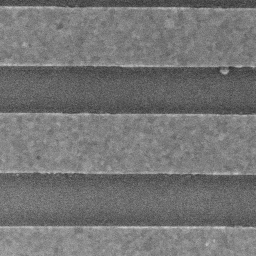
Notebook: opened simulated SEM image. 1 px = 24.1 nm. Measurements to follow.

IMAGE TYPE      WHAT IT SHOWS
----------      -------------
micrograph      lines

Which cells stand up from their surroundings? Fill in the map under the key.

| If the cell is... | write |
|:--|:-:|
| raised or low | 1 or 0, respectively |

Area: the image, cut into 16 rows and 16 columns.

1111000000000000
1111111111111111
1111111111111111
1111111111111111
0000000000000000
0000000000000000
0000000000000000
1111111111111111
1111111111111111
1111111111111111
1111111111111111
0000000000000000
0000000000000000
0000000000000000
1111111111111111
1111111111111111